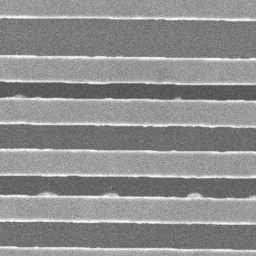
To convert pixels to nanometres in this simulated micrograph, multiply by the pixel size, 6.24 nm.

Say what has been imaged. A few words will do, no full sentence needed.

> lines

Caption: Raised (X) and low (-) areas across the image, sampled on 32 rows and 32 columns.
XXXXXXXXXXXXXXXXXXXXXXXXXXXXXXXX
XXXXXXXXXXXXXXXXXXXXXXXXXXXXXXXX
---------------------------XXXXX
--------------------------------
--------------------------------
--------------------------------
--------------------------------
XXXXXXXXXXXXXXXXXXXXXXXXXXXXXXXX
XXXXXXXXXXXXXXXXXXXXXXXXXXXXXXXX
XXXXXXXXXXXXXXXXXXXXXXXXXXXXXXXX
----------------------XXXXXXXXXX
--------------------------------
XXXXXXXXXXXXXXXXXXXX--X---------
XXXXXXXXXXXXXXXXXXXXXXXXXXXXXXXX
XXXXXXXXXXXXXXXXXXXXXXXXXXXXXXXX
----XXXXXXXXXXXXXXXXXXXXXXXXXXXX
--------------------------------
--------------------------------
--------------------------------
XXXXXXXXXXXXXXXXXXXXXXXXXXXXXXXX
XXXXXXXXXXXXXXXXXXXXXXXXXXXXXXXX
XXXXXXXXXXXXXXXXXXXXXXXXXXXXXXXX
--------------------------------
--------------------------------
XXXX-XX-------------------------
XXXXXXXXXXXXXXXXXXXXXXXXXXXXXXXX
XXXXXXXXXXXXXXXXXXXXXXXXXXXXXXXX
XXXXXXXXXXXXXXXXXXXXXXXXXXXXXXXX
--------------------------------
--------------------------------
--------------------------------
XXXXXXXXXXXXXXXXXXXXXXXXXXXXXXXX